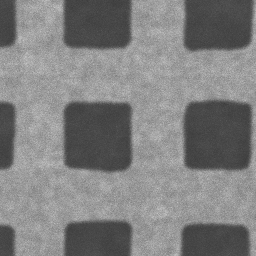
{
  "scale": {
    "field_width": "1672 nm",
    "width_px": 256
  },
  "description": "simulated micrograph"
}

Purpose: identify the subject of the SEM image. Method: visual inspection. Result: holes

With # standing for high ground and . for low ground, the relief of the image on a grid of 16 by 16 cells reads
.###....####....
.###....####....
.###....###.....
################
################
################
.###....####...#
.###....###.....
.###....###.....
.###....###.....
.###....####...#
################
################
################
.###....###.....
.###....###.....